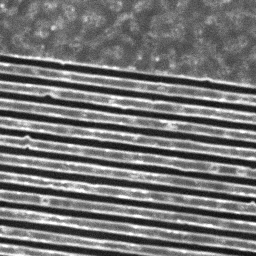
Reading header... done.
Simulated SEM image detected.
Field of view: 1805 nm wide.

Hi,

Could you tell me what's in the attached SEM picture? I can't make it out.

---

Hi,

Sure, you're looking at parallel lines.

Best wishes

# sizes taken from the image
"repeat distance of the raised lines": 127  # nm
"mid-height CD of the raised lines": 70.8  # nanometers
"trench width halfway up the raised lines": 57.7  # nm